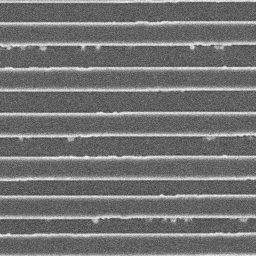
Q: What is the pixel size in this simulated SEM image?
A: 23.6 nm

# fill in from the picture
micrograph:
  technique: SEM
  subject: lines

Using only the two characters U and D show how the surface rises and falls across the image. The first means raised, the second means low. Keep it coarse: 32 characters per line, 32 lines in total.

DDDDDDDDDDDDDDDDDDDDDDDDDDDDDDDD
DDDDDDDDDDDDDDDDDDDDDDDDDDDDDDDD
DDDDDDDDDDDDDDDDDDDDDDDDDDDDDDDD
UUUUUUUUUUUUUUUUUUUUUUUUUUUUUUUU
UUUUUUUUUUUUUUUUUUUUUUUUUUUUUUUU
UUUUUUUUUUUUUUUUUUUUUUUUUUUUUDDD
DDDDDDDDDDDDDDDDDDDDDDDDDDDDDDDD
DDDDDDDDDDDDDDDDDDDDDDDDDDDDDDDD
UUDUUDUUUUDUUUUUUUUUUUUUUUUUUUUU
UUUUUUUUUUUUUUUUUUUUUUUUUUUUUUUU
UUUUUUUUUUUUUUUUUUUUUUUUUUUUUUUU
DDDDDDDDDDDDDDDDDDDDDDDDDDDDDDDD
DDDDDDDDDDDDDDDDDDDDDDDDDDDDDDDD
DDDDDDDDDDDDDDDDDDDDDDDDDDDDDDDD
UUUUUUUUUUUUUUUUUUUUUUUUUUUUUUUU
UUUUUUUUUUUUUUUUUUUUUUUUUUUUUUUU
UUUUUUUUUUUUUUUUUUUUUUUUUUUUUUUU
DDDDDDDDDDDDDDDDDDDDDDDDDDDDDDDD
DDDDDDDDDDDDDDDDDDDDDDDDDDDDDDDD
DDDDDDDDDDDDDDDDDDDDDDDDDDDDDDDD
UUUUUUUUUUUUUUUUUUUUUUUUUUUUUUUU
UUUUUUUUUUUUUUUUUUUUUUUUUUUUUUUU
UUUDDDDDDDDDDDDDDDDDDDDDDDDDDDDD
DDDDDDDDDDDDDDDDDDDDDDDDDDDDDDDD
DDDDDDDDDDDDDDDDDDDDUDUUUUUUUUUU
UUUUUUUUUUUUUUUUUUUUUUUUUUUUUUUU
UUUUUUUUUUUUUUUUUUUUUUUUUUUUUUUU
DDDDDDDDDDDDDDDDDDDDDDDDDDDDDDDD
DDDDDDDDDDDDDDDDDDDDDDDDDDDDDDDD
UUUUUUUUUUUUUUUUUUUUUUUUUUUUUUUU
UUUUUUUUUUUUUUUUUUUUUUUUUUUUUUUU
UUUUUUUUUUUUUUUUUUUUUUUUUUUUUUUU